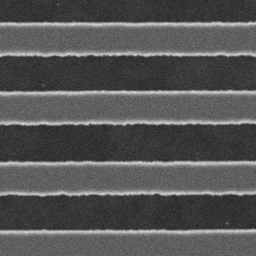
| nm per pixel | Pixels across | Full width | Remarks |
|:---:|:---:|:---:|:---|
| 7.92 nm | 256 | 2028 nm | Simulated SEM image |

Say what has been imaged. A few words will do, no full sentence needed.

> lines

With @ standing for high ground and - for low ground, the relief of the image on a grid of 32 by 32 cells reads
--------------------------------
--------------------------------
--------------------------------
@@@@@@@@@@@@@@@@@@@@@@@@@@@@@@@@
@@@@@@@@@@@@@@@@@@@@@@@@@@@@@@@@
@@@@@@@@@@@@@@@@@@@@@@@@@@@@@@@@
@@@@@@@@@@@@@@@@@@@@@@@@@@@@@@@@
--------------------------------
--------------------------------
--------------------------------
--------------------------------
----------@@@@@@@@@@@@@@@@@@@@@@
@@@@@@@@@@@@@@@@@@@@@@@@@@@@@@@@
@@@@@@@@@@@@@@@@@@@@@@@@@@@@@@@@
@@@@@@@@@@@@@@@@@@@@@@@@@@@@@@@@
@-@@@-@@-@@---@@------@---------
--------------------------------
--------------------------------
--------------------------------
--------------------------------
@@@@@@@@@@@@@@@@@@@@@@@@@@@@@@@@
@@@@@@@@@@@@@@@@@@@@@@@@@@@@@@@@
@@@@@@@@@@@@@@@@@@@@@@@@@@@@@@@@
@@@@@@@@@@@@@@@@@@@@@@@@@@@@@@@@
--------------------------------
--------------------------------
--------------------------------
--------------------------------
--------------------------------
@@@@@@@@@@@@@@@@@@@@@@@@@@@@@@@@
@@@@@@@@@@@@@@@@@@@@@@@@@@@@@@@@
@@@@@@@@@@@@@@@@@@@@@@@@@@@@@@@@